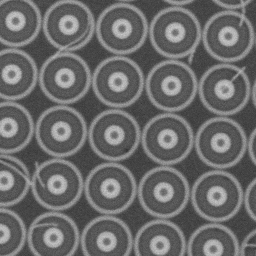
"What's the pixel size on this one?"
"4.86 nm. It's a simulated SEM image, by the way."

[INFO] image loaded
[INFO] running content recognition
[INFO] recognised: an array of small figures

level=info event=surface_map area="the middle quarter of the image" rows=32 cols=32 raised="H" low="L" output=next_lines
LLLLLHHHHLLLLLLLLLHHHHHHLLLLLLHH
LLLLLLHHLLLLLLLLLLLHHHHLLLLLLLLH
HHLLLLHHLLLLLLLLLLLHHHLLLLLLLLLL
HHLLLLHHLLLLHHHLLLLHHLLLLLLLLLLL
HHLLLLHHLLLLHHHLLLLHHLLLLHHHLLLL
LLLLLLHHLLLLHHHLLLLHHLLLLHHHHLLL
LLLLLHHHLLLLLLLLLLLHHLLLLHHHLLLL
LLLLHHHHHLLLLLLLLLLHHLLLLLLLLLLL
LLLHHHHHHLLLLLLLLLHHHHLLLLLLLLLL
HHHHHHHHHHLLLLLLLHHHHHHLLLLLLLLH
HHHHHHHHHHHHHHHHHHHHHHHHLLLLLLHH
LLHHHHHHHHHHHHHHHHHHHHHHHHHHHHHH
LLLHHHHHHHLLLLLHHHHHHHHHHHHHHHHH
LLLLHHHHHLLLLLLLHHHHHHHLLLLLLHHH
LLLLLHHHLLLLLLLLLHHHHHLLLLLLLLHH
HLLLLHHLLLLLLLLLLLHHHLLLLLLLLLLH
HLLLLHHLLLLHHHLLLLHHHLLLLLLLLLLH
HLLLLHHLLLLHHHLLLLLHLLLLLHHLLLLL
LLLLLHHLLLLHHHLLLLHHLLLLHHHHLLLL
LLLLLHHLLLLLHHLLLLHHLLLLHHHHLLLL
LLLLHHHLLLLLLLLLLLHHLLLLLHHLLLLL
LLLHHHHHLLLLLLLLLHHHHLLLLLLLLLLH
LHHHHHHHHLLLLLLLHHHHHLLLLLLLLLHH
HHHHHHHHHHHLLLHHHHHHHHLLLLLLLHHH
HHHHHHHHHHHHHHHHHHHHHHHHHLLHHHHH
LLHHHHHHHHLLLHHHHHHHHHHHHHHHHHHH
LLLHHHHHLLLLLLLHHHHHHHHLLLLHHHHH
LLLLHHHLLLLLLLLLHHHHHLLLLLLLHHHH
LLLLHHLLLLLLLLLLLHHHLLLLLLLLLLHH
LLLLHHLLLLLHLLLLLHHHLLLLLLLLLLHH
LLLLHHLLLLHHHLLLLHHLLLLLHHLLLLLH
LLLLHHLLLLHHHHLLLLHLLLLHHHHLLLLH